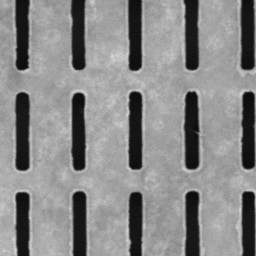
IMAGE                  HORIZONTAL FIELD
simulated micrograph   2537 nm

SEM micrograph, holes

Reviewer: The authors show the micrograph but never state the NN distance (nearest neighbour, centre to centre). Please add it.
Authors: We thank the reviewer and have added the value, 558 nanometres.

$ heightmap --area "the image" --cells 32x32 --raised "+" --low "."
++..+++++..+++++..+++++..+++++..
++..+++++..+++++..+++++..+++++..
++..+++++..+++++..+++++..+++++..
++..+++++..+++++..+++++..+++++..
++..+++++..+++++..+++++..+++++..
++..+++++..+++++..+++++..+++++..
++..+++++..+++++..+++++..+++++..
++..+++++..+++++..+++++..+++++..
++.++++++.++++++..+++++..+++++..
++++++++++++++++++++++++++++++++
++++++++++++++++++++++++++++++++
++++++++++++++++++++++++++++++++
++..+++++..+++++..+++++..+++++..
++..+++++..+++++..+++++..+++++..
++..+++++..+++++..+++++..+++++..
++..+++++..+++++..+++++..+++++..
++..+++++..+++++..+++++..+++++..
++..+++++..+++++..+++++..+++++..
++..+++++..+++++..+++++..+++++..
++..+++++..+++++..+++++..+++++..
++..+++++..+++++..+++++..+++++..
++++++++++++++++++++++++++++++++
++++++++++++++++++++++++++++++++
++++++++++++++++++++++++++++++++
++..+++++..+++++..+++++..+++++..
++..+++++..+++++..+++++..+++++..
++..+++++..+++++..+++++..+++++..
++..+++++..+++++..+++++..+++++..
++..+++++..+++++..+++++..+++++..
++..+++++..+++++..+++++..+++++..
++..+++++..+++++..+++++..+++++..
++..+++++..+++++..+++++..+++++..